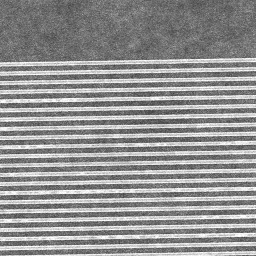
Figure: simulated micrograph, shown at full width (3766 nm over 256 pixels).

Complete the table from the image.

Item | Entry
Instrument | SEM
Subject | parallel lines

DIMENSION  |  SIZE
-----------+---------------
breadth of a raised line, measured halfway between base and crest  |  40.4 nm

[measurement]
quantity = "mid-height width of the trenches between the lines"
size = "91.9 nanometres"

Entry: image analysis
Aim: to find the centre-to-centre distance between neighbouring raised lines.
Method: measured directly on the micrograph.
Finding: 135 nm